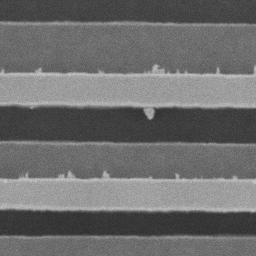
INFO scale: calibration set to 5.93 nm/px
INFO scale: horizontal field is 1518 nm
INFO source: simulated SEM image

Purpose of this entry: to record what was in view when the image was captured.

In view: lines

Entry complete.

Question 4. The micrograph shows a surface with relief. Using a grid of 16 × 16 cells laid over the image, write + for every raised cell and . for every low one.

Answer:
................
+++++++++++.....
++++++++++++++++
++++++++++++++++
++++++++++++++++
++++++++++++++++
++++++++++++++++
................
................
++++++++++++++++
++++++++++++++++
++++++++++++++++
++++++++++++++++
................
................
++++++++++++++++